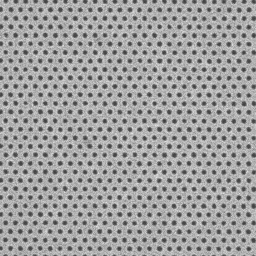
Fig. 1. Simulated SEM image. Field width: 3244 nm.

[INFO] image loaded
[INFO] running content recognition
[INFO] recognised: a regular array of holes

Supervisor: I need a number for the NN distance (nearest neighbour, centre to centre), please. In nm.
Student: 121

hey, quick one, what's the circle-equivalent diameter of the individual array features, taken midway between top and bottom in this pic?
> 65.5 nanometres